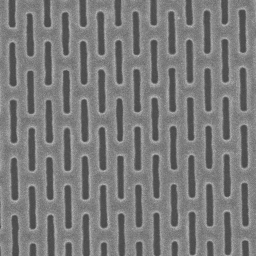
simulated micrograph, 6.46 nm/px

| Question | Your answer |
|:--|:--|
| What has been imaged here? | a regular array of holes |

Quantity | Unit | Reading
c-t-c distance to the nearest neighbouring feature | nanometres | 216